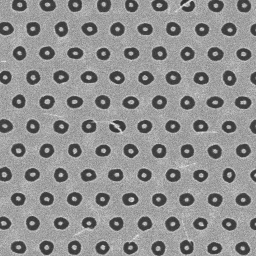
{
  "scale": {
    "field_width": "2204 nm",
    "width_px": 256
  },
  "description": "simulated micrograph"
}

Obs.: a regular array of ring-shaped grooves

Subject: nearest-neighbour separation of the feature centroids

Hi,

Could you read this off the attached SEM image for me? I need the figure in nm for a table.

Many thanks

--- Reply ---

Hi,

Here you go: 237